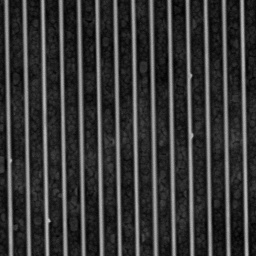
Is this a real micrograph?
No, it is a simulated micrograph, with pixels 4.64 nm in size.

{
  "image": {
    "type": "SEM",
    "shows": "parallel lines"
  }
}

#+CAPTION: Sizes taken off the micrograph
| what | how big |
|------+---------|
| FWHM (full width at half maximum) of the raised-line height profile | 17.4 nm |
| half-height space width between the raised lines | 65.5 nm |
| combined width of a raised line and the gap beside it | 84.1 nanometres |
